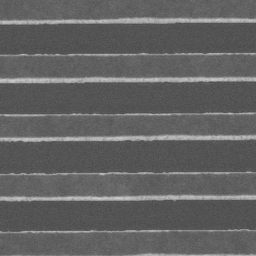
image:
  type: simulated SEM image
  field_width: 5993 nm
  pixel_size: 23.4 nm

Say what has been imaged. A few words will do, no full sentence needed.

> lines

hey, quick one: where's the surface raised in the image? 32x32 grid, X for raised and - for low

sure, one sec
XXXXXXXXXXXXXXXXXXXXXXXXXXXXXXXX
XXXXXXXXXXXXXXXXXXXXXXXXXXXXXXXX
XXXXXXXXXXXXXXXXXXXXXXXXXXXXXXXX
--------------------------------
--------------------------------
--------------------------------
--------------------------------
XXXXXXXXXXXXXXXXXXXXXXXXXXXXXXXX
XXXXXXXXXXXXXXXXXXXXXXXXXXXXXXXX
XXXXXXXXXXXXXXXXXXXXXXXXXXXXXXXX
--------------------------------
--------------------------------
--------------------------------
--------------------------------
XXXXXXXXXXXXXXXXXXXXXXXXXXXXXXXX
XXXXXXXXXXXXXXXXXXXXXXXXXXXXXXXX
XXXXXXXXXXXXXXXXXXXXXXXXXXXXXXXX
--------------------------------
--------------------------------
--------------------------------
--------------------------------
--------------------------------
XXXXXXXXXXXXXXXXXXXXXXXXXXXXXXXX
XXXXXXXXXXXXXXXXXXXXXXXXXXXXXXXX
XXXXXXXXXXXXXXXXXXXXXXXXXXXXXXXX
--------------------------------
--------------------------------
--------------------------------
--------------------------------
XXXXXXXXXXXXXXXXXXXXXXXXXXXXXXXX
XXXXXXXXXXXXXXXXXXXXXXXXXXXXXXXX
XXXXXXXXXXXXXXXXXXXXXXXXXXXXXXXX